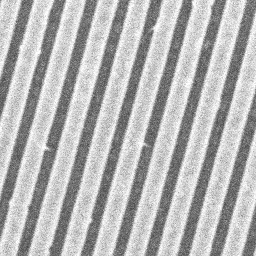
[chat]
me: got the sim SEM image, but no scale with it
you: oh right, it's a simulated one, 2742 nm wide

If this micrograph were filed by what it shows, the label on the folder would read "parallel lines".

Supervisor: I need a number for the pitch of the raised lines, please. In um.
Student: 0.333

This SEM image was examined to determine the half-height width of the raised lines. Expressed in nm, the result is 196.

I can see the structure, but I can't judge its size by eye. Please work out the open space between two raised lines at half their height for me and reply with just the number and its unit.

141 nanometres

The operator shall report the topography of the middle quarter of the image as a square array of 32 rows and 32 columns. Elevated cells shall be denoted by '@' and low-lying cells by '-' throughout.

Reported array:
@---@@@@@---@@@@@---@@@@@---@@@@
@---@@@@@---@@@@@---@@@@@---@@@@
----@@@@----@@@@----@@@@----@@@@
---@@@@@---@@@@@---@@@@@---@@@@@
---@@@@@---@@@@@---@@@@@---@@@@@
---@@@@----@@@@@---@@@@@---@@@@@
---@@@@----@@@@----@@@@----@@@@-
--@@@@@---@@@@@---@@@@@----@@@@-
--@@@@@---@@@@@---@@@@@---@@@@@-
--@@@@----@@@@----@@@@----@@@@@-
--@@@@----@@@@---@@@@@----@@@@--
-@@@@@---@@@@@---@@@@@---@@@@@--
-@@@@@---@@@@@---@@@@@---@@@@@--
-@@@@----@@@@----@@@@----@@@@---
@@@@@---@@@@@---@@@@@---@@@@@---
@@@@@---@@@@@---@@@@@---@@@@@---
@@@@----@@@@@---@@@@----@@@@@---
@@@@----@@@@----@@@@----@@@@----
@@@@---@@@@@---@@@@@---@@@@@----
@@@@---@@@@@---@@@@@---@@@@@---@
@@@----@@@@----@@@@@---@@@@@---@
@@@---@@@@@---@@@@@----@@@@----@
@@@---@@@@@---@@@@@---@@@@@---@@
@@@---@@@@@---@@@@@---@@@@@---@@
@@----@@@@----@@@@----@@@@----@@
@@---@@@@@---@@@@@---@@@@@----@@
@@---@@@@@---@@@@@---@@@@@---@@@
@----@@@@----@@@@----@@@@----@@@
@----@@@@----@@@@----@@@@----@@@
@----@@@@---@@@@@---@@@@@---@@@@
@---@@@@@---@@@@@---@@@@@---@@@@
----@@@@----@@@@----@@@@@---@@@@